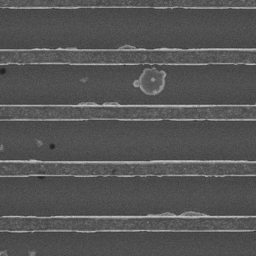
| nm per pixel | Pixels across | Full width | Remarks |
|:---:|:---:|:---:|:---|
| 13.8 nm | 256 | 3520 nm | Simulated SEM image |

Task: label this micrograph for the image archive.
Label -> lines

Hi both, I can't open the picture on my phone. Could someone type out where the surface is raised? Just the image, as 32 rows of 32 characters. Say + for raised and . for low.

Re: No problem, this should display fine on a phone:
++++++++++++++++++++++++++++++++
................................
................................
................................
................................
................................
++++++++++++++++++++++++++++++++
++++++++++++++++++++++++++++++++
................................
................................
................................
................................
................................
++++++++++++++++++++++++++++++++
++++++++++++++++++++++++++++++++
................................
................................
................................
................................
................................
++++++++++++++++++++++++++++++++
++++++++++++++++++++++++++++++++
................................
................................
................................
................................
................................
++++++++++++++++++++++++++++++++
++++++++++++++++++++++++++++++++
................................
................................
................................